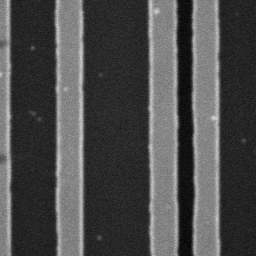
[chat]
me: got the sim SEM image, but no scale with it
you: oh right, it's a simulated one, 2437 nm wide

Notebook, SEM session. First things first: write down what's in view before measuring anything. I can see lines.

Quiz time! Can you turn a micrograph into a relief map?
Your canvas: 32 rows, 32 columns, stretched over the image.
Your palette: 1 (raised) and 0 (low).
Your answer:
10000001110000000001110011100000
10000001110000000001110011100000
10000001110000000001110011100000
10000001110000000001110011100000
10000001110000000001110011100000
10000001110000000001110011100000
10000001110000000001110011100000
10000001110000000001110011100000
10000001110000000001110011100000
10000001110000000001110011100000
10000001110000000001110011100000
10000001110000000001110011100000
10000001110000000001110011100000
10000001110000000001110011100000
10000001110000000001110011100000
10000001110000000001110011100000
10000001110000000001110011100000
10000001110000000001110011100000
10000001110000000001110011100000
10000001110000000001110011100000
10000001110000000001110011100000
10000001110000000001110011100000
10000001110000000001110011100000
10000001110000000001110011100000
10000001110000000001110011100000
10000001110000000001110011100000
10000001110000000001110011100000
10000001110000000001110011100000
10000001110000000001110011100000
10000001110000000001110011100000
10000001110000000001110011100000
10000001110000000001110011100000